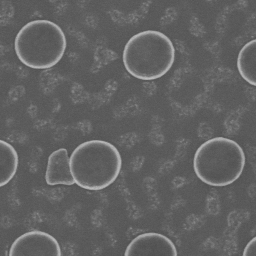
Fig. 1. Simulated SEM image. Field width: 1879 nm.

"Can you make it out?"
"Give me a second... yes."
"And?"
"raised bodies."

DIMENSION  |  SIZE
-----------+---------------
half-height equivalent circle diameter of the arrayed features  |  351 nanometers